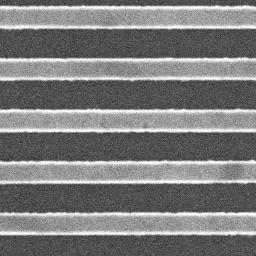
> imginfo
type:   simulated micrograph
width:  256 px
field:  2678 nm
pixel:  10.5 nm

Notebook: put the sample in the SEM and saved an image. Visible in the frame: lines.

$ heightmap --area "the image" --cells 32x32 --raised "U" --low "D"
DDDDDDDDDDDDDDDDDDDDDDDDDDDDDDDD
UUUUUUUUUUUUUUUUUUUUUUUUUUUUUUUU
UUUUUUUUUUUUUUUUUUUUUUUUUUUUUUUU
DDDDDDDDDDDDDUDDDDDDDDDDDDDDDDDD
DDDDDDDDDDDDDDDDDDDDDDDDDDDDDDDD
DDDDDDDDDDDDDDDDDDDDDDDDDDDDDDDD
DDDDDDDDDDDDDDDDDDDDDDDDDDDDDDDD
UUUUUUUUUUUUUUUUUUUUUUUUUUUUUUUU
UUUUUUUUUUUUUUUUUUUUUUUUUUUUUUUU
UUUUUUUUUUUUUUUUUUUUUUUUUUUUUUUU
DDDDDDDDDDDDDDDDDDDDDDDDDDDDDDDD
DDDDDDDDDDDDDDDDDDDDDDDDDDDDDDDD
DDDDDDDDDDDDDDDDDDDDDDDDDDDDDDDD
DDDDDDDDDDDDDDDDDDDDDDDDDDDDDDDD
UUUUUUUUUUUUUUUUUUUUUUUUUUUUUUUU
UUUUUUUUUUUUUUUUUUUUUUUUUUUUUUUU
DDDDDDDDDDDDDDDDDDDDDDDDDDDDDDDD
DDDDDDDDDDDDDDDDDDDDDDDDDDDDDDDD
DDDDDDDDDDDDDDDDDDDDDDDDDDDDDDDD
DDDDDDDDDDDDDDDDDDDDDDDDDDDDDDDD
UUUUUUUUUUUUUUUUUUUUUUUUUUUUUUUU
UUUUUUUUUUUUUUUUUUUUUUUUUUUUUUUU
UUUUUUUUUUUUUUUUUUUUUUUUUUUUUUUU
DDDDDDDDDDDDDDDDDDDDDDDDDDDDDDDD
DDDDDDDDDDDDDDDDDDDDDDDDDDDDDDDD
DDDDDDDDDDDDDDDDDDDDDDDDDDDDDDDD
DDDDDDDDDDDDDDDDDDDDDDDDDDDDDDDD
UUUUUUUUUUUUUUUUUUUUUUUUUUUUUUUU
UUUUUUUUUUUUUUUUUUUUUUUUUUUUUUUU
DDDDDDDDDDDDDDDDDDDDDDDDDDDDDDDD
DDDDDDDDDDDDDDDDDDDDDDDDDDDDDDDD
DDDDDDDDDDDDDDDDDDDDDDDDDDDDDDDD